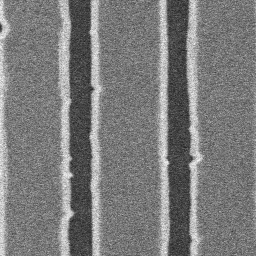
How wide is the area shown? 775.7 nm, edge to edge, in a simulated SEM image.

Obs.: one or a few lines or trenches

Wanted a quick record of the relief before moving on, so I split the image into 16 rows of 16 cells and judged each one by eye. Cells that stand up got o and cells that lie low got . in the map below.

oooo..oooo..oooo
oooo..oooo..oooo
oooo..oooo..oooo
oooo..oooo..oooo
oooo..oooo..oooo
oooo..oooo..oooo
oooo..oooo..oooo
oooo..oooo..oooo
oooo..oooo..oooo
oooo..oooo..oooo
oooo..oooo..oooo
oooo..oooo..oooo
oooo..oooo..oooo
oooo..oooo..oooo
oooo..oooo..oooo
oooo..oooo..oooo